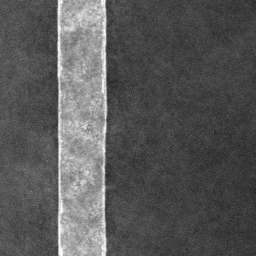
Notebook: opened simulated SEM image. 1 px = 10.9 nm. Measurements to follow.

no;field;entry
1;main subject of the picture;one or a few lines or trenches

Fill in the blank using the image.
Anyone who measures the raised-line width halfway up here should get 0.502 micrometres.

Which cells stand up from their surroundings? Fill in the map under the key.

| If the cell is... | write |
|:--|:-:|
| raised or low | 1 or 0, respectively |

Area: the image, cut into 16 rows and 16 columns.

0000111000000000
0000111000000000
0000111000000000
0000111000000000
0000111000000000
0000111000000000
0000111000000000
0000111000000000
0000111000000000
0000110000000000
0000111000000000
0000111000000000
0000111000000000
0000111000000000
0000111000000000
0000111000000000